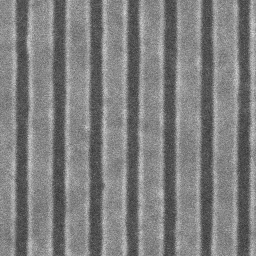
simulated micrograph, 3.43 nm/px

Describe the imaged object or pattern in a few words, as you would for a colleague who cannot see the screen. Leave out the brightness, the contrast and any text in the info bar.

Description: parallel lines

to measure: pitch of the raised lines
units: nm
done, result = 127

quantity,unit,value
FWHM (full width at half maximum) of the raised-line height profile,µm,0.0771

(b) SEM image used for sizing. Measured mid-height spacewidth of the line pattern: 14.3 px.